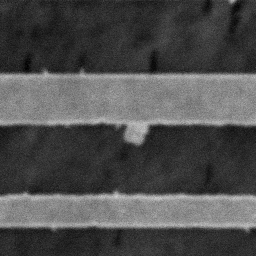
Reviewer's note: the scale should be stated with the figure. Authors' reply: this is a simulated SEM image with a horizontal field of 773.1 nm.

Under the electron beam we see one or a few lines or trenches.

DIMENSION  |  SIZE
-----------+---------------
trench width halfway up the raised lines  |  73.4 pixels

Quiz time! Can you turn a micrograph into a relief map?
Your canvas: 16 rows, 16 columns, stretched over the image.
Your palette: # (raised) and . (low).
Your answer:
................
................
................
................
................
################
################
################
................
................
................
................
################
################
................
................